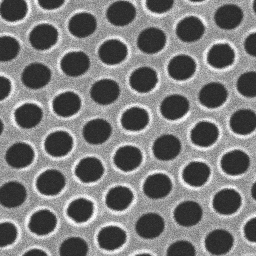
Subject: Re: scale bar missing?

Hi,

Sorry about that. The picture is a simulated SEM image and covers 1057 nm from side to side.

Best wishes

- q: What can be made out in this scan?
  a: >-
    a regular array of holes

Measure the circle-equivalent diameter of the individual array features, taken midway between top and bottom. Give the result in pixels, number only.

27.7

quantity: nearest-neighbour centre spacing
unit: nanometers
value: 165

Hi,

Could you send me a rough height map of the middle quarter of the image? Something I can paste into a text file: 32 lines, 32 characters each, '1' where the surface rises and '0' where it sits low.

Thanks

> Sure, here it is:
00000001111111111111111111000000
00000011111111111100001111000000
00000111111111111000000111000000
11111111111111110000000011100000
11111111000001110000000111111111
11111110000000111000000111111111
11111110000000111100001111111111
00011110000000111111111111111111
00001110000001111111111110000001
00001111000001111111111100000001
00001111111111111111111100000001
00001111111111110000111100000001
00011111111111100000011100000001
11111111111111000000011110000111
11111100000111000000011111111111
11111000000011000000011111111111
11111000000011110001111111111111
01111000000011111111111110111111
00111000000111111111111000001111
00111100001111111111110000000111
00111111111111100111110000000111
00111111111110000001110000000111
01111111111110000000110000000111
11111000111100000000111000001111
11110000011100000001111111111111
11100000001110000001111111111110
11100000001111000011111111111100
11100000001111111111110001111100
11110000011111111111100000111100
11111000111111111111000000011100
11111111111110011111000000011111
11111111111000000111000000011111